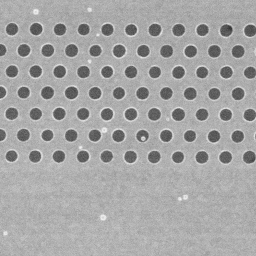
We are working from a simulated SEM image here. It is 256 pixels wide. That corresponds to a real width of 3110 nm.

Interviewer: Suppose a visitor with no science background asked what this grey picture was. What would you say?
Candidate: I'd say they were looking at a regular array of holes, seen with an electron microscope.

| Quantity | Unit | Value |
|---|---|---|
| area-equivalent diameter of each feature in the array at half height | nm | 162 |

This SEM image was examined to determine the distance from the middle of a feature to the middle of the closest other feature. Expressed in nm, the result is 288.